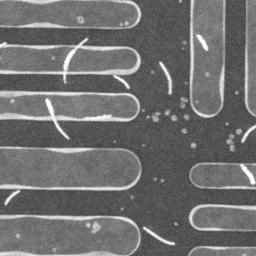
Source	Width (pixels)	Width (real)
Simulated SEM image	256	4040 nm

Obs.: groups of lines, slits or small figures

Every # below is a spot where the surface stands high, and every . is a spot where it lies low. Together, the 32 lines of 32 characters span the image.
#################.......####...#
#################.......####...#
#################.......####...#
............####........####...#
........................####...#
........................####...#
#################.......####...#
#################.......####...#
#################.......####...#
........................####...#
........................####...#
........................####...#
#################.......####...#
#################.......####...#
#.###############...............
................................
................................
................................
###.............................
#################...............
#################........#####..
##################......########
#################.......########
................................
................................
................................
........................########
################........########
#################........#######
#################...............
#################...............
#################.......########